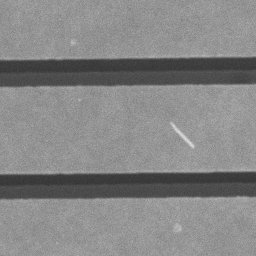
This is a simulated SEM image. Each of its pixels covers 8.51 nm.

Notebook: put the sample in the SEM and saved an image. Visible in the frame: lines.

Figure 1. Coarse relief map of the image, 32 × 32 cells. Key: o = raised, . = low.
oooooooooooooooooooooooooooooooo
oooooooooooooooooooooooooooooooo
oooooooooooooooooooooooooooooooo
oooooooooooooooooooooooooooooooo
oooooooooooooooooooooooooooooooo
oooooooooooooooooooooooooooooooo
oooooooooooooooooooooooooooooooo
................................
................................
................................
................................
oooooooooooooooooooooooooooooooo
oooooooooooooooooooooooooooooooo
oooooooooooooooooooooooooooooooo
oooooooooooooooooooooooooooooooo
oooooooooooooooooooooooooooooooo
oooooooooooooooooooooooooooooooo
oooooooooooooooooooooooooooooooo
oooooooooooooooooooooooooooooooo
oooooooooooooooooooooooooooooooo
oooooooooooooooooooooooooooooooo
ooooooooooooooooooooooooooo.....
................................
................................
................................
oooooooooooooooooooooooooooooooo
oooooooooooooooooooooooooooooooo
oooooooooooooooooooooooooooooooo
oooooooooooooooooooooooooooooooo
oooooooooooooooooooooooooooooooo
oooooooooooooooooooooooooooooooo
oooooooooooooooooooooooooooooooo